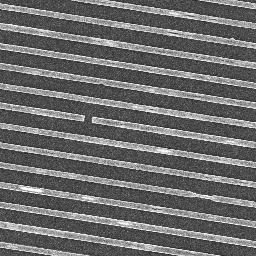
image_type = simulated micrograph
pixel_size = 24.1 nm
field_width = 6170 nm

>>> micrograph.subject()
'parallel lines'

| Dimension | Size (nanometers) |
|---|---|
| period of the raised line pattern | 472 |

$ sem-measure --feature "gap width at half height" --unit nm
333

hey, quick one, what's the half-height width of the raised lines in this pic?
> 137 nanometers